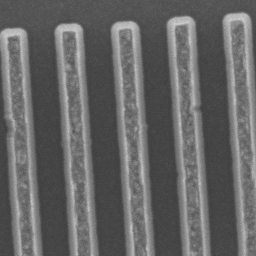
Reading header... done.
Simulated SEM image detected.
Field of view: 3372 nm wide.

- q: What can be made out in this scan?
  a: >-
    parallel lines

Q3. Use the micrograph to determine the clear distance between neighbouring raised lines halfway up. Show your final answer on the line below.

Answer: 453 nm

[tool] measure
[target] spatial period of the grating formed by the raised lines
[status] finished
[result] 0.737 micrometres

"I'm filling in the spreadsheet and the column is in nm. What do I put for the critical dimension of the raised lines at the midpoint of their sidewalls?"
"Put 287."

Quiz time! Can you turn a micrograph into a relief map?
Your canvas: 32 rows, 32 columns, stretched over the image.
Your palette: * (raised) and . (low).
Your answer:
................................
................................
............................***.
........**.....**....***....***.
***....***....***....***....***.
***....***....***....***....***.
.**....***.....**.....**.....**.
.**.....**.....**.....**.....**.
.**.....**.....**.....**.....**.
.**.....**.....**.....**.....**.
.**.....**.....***....**.....**.
.**.....**.....**.....***....***
.**.....***....***....***....***
.***....***....***....***....***
.***....***....***....***....***
.***....***....***....***....***
.***....***....***....***....***
.***....***....***....***....***
.***....***....***....***....***
.***....***....***....***....***
.***....***....***....***.....**
..**....***.....**.....**.....**
..**.....**.....**.....**.....**
..**.....**.....**.....**.....**
..**.....**.....**.....***....**
..**.....**.....**.....***....**
..***....**.....***....***....**
..***....***....***....***....**
..***....***....***....***....**
..***....***....***....***....**
..***....***....***....***....**
..***....***....***....***....**